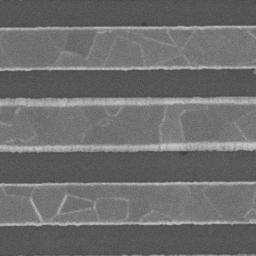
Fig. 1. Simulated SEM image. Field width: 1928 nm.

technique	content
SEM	lines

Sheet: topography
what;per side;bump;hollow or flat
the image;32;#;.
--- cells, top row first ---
................................
................................
................................
....############################
################################
################################
################################
################################
################################
................................
................................
................................
..................#.############
################################
################################
################################
################################
################################
########################..######
................................
................................
................................
................................
################################
################################
################################
################################
################################
................................
................................
................................
................................